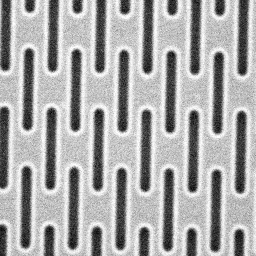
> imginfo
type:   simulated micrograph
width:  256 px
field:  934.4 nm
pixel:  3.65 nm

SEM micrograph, groups of lines, slits or small figures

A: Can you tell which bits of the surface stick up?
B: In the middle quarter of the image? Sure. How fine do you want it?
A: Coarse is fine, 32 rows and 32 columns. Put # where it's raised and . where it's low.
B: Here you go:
##...##....##....##....##...###.
##...###..###....##...###...###.
##...########....###..###...####
#....########....########...####
#....########....########...####
#....########...#########...####
#....########...#########...####
#....########...#########...####
#....########...#########...####
#....########...#########...####
#....########...#########...####
#...####..###...####..###...####
#...###...###...###...###...###.
#...###...###...###...###...###.
#...###...###...###...###...###.
#...###...###...###...###...###.
##..###...###...###...###...###.
#######...#########...####.####.
#######...#########...#########.
#######...#########...#########.
#######...#########...#########.
#######...#########...#########.
#######...#########...#########.
#######...#########...#########.
#######...#########...#########.
##.####...#########...#########.
#...###...###...###...###..####.
#...###...###...###...###...###.
#...###...###...###...###...###.
#...###...###...###...###...###.
#...###...###...###...###...###.
#...###...###...###..####...###.